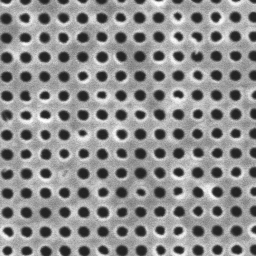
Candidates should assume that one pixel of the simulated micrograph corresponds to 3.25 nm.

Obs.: a regular array of holes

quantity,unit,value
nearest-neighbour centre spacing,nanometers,61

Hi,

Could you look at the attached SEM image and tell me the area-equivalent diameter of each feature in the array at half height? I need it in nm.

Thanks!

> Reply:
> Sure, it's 36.